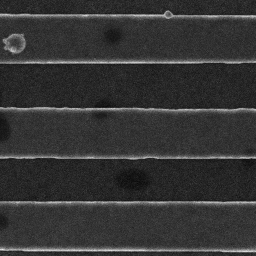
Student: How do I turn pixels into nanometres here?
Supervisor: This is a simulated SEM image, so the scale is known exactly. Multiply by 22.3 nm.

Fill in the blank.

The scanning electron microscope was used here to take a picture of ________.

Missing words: lines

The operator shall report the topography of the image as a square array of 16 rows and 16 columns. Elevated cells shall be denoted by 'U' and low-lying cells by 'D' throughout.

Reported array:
DDDDDDDDDDDDDDDD
UUUUUUUUUUUUUUUU
UUUUUUUUUUUUUUUU
UUUUUUUUUUUUUUUU
DDDDDDDDDDDDDDDD
DDDDDDDDDDDDDDDD
DDDDDDDDDDDDDDDD
UUUUUUUUUUUUUUUU
UUUUUUUUUUUUUUUU
UUUUUUUUUUUUUUUU
DDDDDDDDDDDDDDDD
DDDDDDDDDDDDDDDD
DDDDDDDDDDDDDDDD
UUUUUUUUUUUUUUUU
UUUUUUUUUUUUUUUU
UUUUUUUUUUUUUUUU